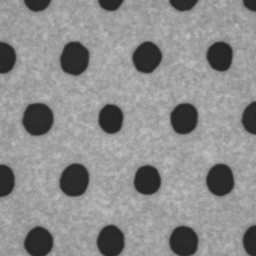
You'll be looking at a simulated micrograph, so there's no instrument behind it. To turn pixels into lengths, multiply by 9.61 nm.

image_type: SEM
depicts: a regular array of holes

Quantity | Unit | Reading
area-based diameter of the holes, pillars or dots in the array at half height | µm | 0.288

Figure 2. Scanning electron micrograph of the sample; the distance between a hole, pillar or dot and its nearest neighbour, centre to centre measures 684 nanometres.